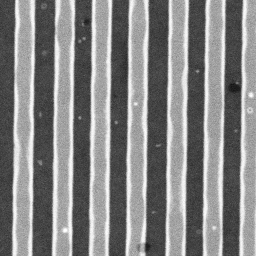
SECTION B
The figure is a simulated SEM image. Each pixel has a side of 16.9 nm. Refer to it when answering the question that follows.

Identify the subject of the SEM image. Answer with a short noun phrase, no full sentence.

wiring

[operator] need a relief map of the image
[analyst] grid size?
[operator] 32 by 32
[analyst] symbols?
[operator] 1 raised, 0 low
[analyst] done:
00110001100011001100011000110001
00110001100011001100011000110001
00110001100011001100011000110001
00110001100011001100011000110011
00110001100011001100011000110001
00110001100011001100011000110001
00110001100011001100011000110011
00110001100011001100011000110011
00110001100011001100011000110011
00110001100011001100011000110011
00110001100011001100011000110011
00110001100011001100011000110011
00110001100011001100011000110011
00110001100011001100011000110011
00110001100011001100011000110011
00110001100011001100011000110011
00110001100011001100011000110011
00110001100011001100011000110011
00110001100010001100011000110011
00110001100011001100011000110011
00110001100011001100011000110011
00110001100011001100011000110011
00110001100110001100011000110011
00110001100110001100011000110011
00110001100110001100011000110011
00110001100110001100011000110011
00110001100111001100011000110011
00110001100111001100011000110011
00110001100010001100011000110011
00110001100110001100011000110011
00110001100110001100011000110011
00110001100110001100011000110011